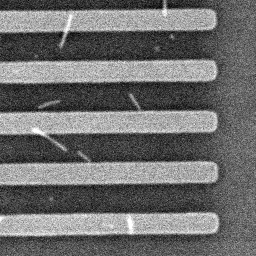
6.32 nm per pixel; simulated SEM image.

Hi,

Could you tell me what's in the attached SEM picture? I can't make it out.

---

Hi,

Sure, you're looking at groups of lines, slits or small figures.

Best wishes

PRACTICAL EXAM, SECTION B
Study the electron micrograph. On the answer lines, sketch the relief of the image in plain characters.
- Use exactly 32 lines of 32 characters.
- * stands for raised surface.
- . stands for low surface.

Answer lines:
................................
........*******************.....
***************************.....
***************************.....
................................
................................
................................
................................
***************************.....
***************************.....
................................
................................
................................
................................
***************************.....
***************************.....
*************...................
................................
................................
................................
..........*****************.....
***************************.....
***************************.....
................................
................................
................................
................................
***************************.....
***************************.....
................................
................................
................................